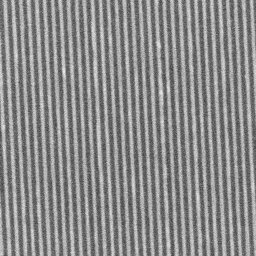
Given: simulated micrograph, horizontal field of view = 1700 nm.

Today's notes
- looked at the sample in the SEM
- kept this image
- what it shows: parallel lines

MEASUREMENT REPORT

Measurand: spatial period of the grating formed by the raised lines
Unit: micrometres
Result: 0.0527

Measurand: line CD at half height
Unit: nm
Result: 20.7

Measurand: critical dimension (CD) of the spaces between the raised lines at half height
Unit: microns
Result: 0.0315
